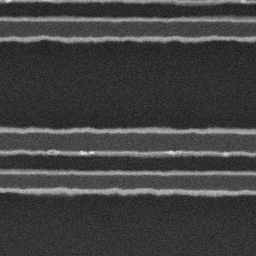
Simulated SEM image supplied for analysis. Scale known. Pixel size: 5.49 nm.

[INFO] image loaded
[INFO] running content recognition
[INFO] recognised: lines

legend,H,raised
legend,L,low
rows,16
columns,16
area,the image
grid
HHHHHHHHHHHHHHHH
HHHHHHHHHHHHHHHH
LLLLLLLLLLLLLLLL
LLLLLLLLLLLLLLLL
LLLLLLLLLLLLLLLL
LLLLLLLLLLLLLLLL
LLLLLLLLLLLLLLLL
LLLLLLLLLLLLLLLL
HHHHHHHHHHHHHHHH
HHHHHHHHHHHHHHHH
HHHHHHHHHHHHHHHH
HHHHHHHHHHHHHHHH
LLLLLLLLLLLLLLLL
LLLLLLLLLLLLLLLL
LLLLLLLLLLLLLLLL
LLLLLLLLLLLLLLLL